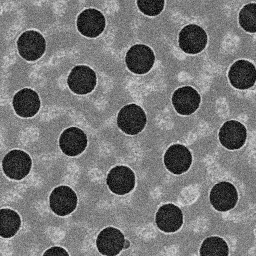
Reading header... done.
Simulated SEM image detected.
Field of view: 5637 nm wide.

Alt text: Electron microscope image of a regular array of holes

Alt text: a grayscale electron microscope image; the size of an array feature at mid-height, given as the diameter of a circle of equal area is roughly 656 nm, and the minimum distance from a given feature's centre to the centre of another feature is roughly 1270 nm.